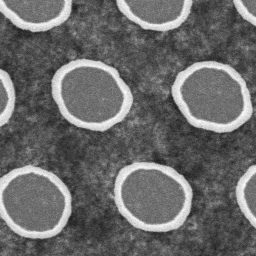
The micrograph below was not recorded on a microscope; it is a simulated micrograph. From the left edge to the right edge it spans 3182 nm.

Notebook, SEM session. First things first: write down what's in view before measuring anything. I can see raised bodies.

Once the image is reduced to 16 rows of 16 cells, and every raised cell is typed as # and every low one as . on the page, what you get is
####....####...#
.##......##.....
................
................
....###.....##..
#...####...####.
#...####...#####
.....##.....###.
................
................
........##......
####...#####...#
####...#####...#
####....###.....
.##.............
................